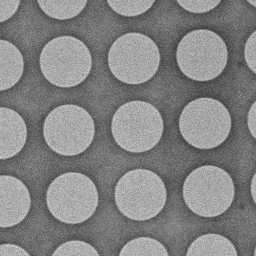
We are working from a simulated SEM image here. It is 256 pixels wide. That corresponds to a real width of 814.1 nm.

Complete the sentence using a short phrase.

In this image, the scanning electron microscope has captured an array of small figures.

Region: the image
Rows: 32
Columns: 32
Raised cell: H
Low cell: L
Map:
HHLLLHHHHHHLLLHHHHHLLLHHHHHLLLLH
HHLLLLHHHHLLLLLHHHLLLLLLHHLLLLLL
HLLLLLLLLLLLLLLLLLLLLLLLLLLLLLLL
LLLLLLLLLLLLLLLLLLLLLLLLLLLLLLLL
LLLLLLLLLLLLLLLHHHLLLLLHHHHLLLLH
HLLLLLHHHHLLLLHHHHHLLLHHHHHHLLLH
HHLLLHHHHHHLLLHHHHHHLLHHHHHHLLLH
HHHLLHHHHHHLLLHHHHHHLLHHHHHHLLLH
HHHLLHHHHHHLLLHHHHHHLLLHHHHHLLLH
HHHLLLHHHHHLLLHHHHHLLLLHHHHLLLLL
HHLLLLLHHHLLLLLLLLLLLLLLLLLLLLLL
LLLLLLLLLLLLLLLLLLLLLLLLLLLLLLLL
LLLLLLLLLLLLLLLLLLLLLLLLHHHLLLLL
HLLLLLLHHHLLLLLHHHHLLLLHHHHHLLLH
HHLLLLHHHHHLLLHHHHHHLLLHHHHHHLLH
HHHLLLHHHHHHLLHHHHHHLLHHHHHHHLLH
HHHLLLHHHHHHLLHHHHHHLLLHHHHHHLLH
HHHLLLHHHHHLLLHHHHHHLLLHHHHHLLLL
HHHLLLHHHHHLLLLHHHHLLLLLLHLLLLLL
HHLLLLLLLLLLLLLLLLLLLLLLLLLLLLLL
LLLLLLLLLLLLLLLLLLLLLLLLLLLLLLLL
LLLLLLLLLLLLLLLLHHHLLLLLHHHHLLLL
HHLLLLLHHHHLLLLHHHHHLLLHHHHHHLLL
HHHLLLHHHHHHLLLHHHHHHLLHHHHHHLLH
HHHHLLHHHHHHLLHHHHHHHLLHHHHHHLLL
HHHHLLHHHHHHLLLHHHHHLLLHHHHHHLLL
HHHLLLHHHHHHLLLHHHHHLLLLHHHHLLLL
HHHLLLLHHHHLLLLLLLLLLLLLLLLLLLLL
LLLLLLLLLLLLLLLLLLLLLLLLLLLLLLLL
LLLLLLLLLLLLLLLLLLLLLLLLLHHHLLLL
LLLLLLLLHHHLLLLLHHHHLLLLHHHHHLLL
HHHLLLLHHHHHLLLHHHHHHLLHHHHHHLLL